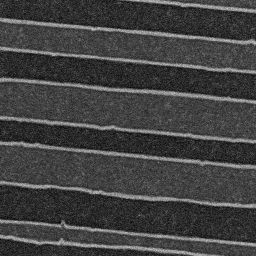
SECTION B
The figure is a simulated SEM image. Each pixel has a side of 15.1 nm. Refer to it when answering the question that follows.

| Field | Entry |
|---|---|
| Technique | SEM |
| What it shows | one or a few lines or trenches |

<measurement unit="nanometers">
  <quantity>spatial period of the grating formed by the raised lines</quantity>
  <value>972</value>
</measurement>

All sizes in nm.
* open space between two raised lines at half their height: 452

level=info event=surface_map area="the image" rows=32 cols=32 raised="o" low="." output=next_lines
......................oooooooooo
................................
................................
ooooooooooo.....................
oooooooooooooooooooooo..........
oooooooooooooooooooooooooooooooo
.....ooooooooooooooooooooooooooo
...............ooooooooooooooooo
..........................oooooo
................................
ooooooo.........................
ooooooooooooooooooo.............
ooooooooooooooooooooooooooooo...
oooooooooooooooooooooooooooooooo
oooooooooooooooooooooooooooooooo
.........ooooooooooooooooooooooo
....................oooooooooooo
.............................ooo
ooooooo.........................
ooooooooooooooooo...............
ooooooooooooooooooooooooooo.....
oooooooooooooooooooooooooooooooo
oooooooooooooooooooooooooooooooo
........oooooooooooooooooooooooo
...............ooooooooooooooooo
...........................ooooo
................................
................................
ooooooooo.......................
ooooooooooooooooooo.............
.........oooooooooooooooooooooo.
......................oooooooooo